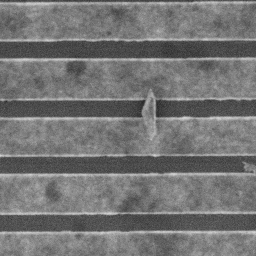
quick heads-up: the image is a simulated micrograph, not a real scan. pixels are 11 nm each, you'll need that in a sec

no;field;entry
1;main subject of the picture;lines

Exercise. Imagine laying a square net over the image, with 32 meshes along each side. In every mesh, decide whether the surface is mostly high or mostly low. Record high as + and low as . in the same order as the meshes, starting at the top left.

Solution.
++++++++++++++++++++++++++++++++
++++++++++++++++++++++++++++++++
++++++++++++++++++++++++++++++++
++++++++++++++++++++++++++++++++
++++++++++++++++++++++++++++++++
................................
................................
++++++++++++++++++++++++++++++++
++++++++++++++++++++++++++++++++
++++++++++++++++++++++++++++++++
++++++++++++++++++++++++++++++++
++++++++++++++++++++++++++++++++
..................++............
..................+.............
..................++............
++++++++++++++++++++++++++++++++
++++++++++++++++++++++++++++++++
++++++++++++++++++++++++++++++++
++++++++++++++++++++++++++++++++
................................
................................
................................
++++++++++++++++++++++++++++++++
++++++++++++++++++++++++++++++++
++++++++++++++++++++++++++++++++
++++++++++++++++++++++++++++++++
++++++++++++++++++++++++++++++++
................................
................................
++++++++++++++++++++++++++++++++
++++++++++++++++++++++++++++++++
++++++++++++++++++++++++++++++++